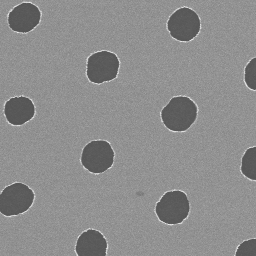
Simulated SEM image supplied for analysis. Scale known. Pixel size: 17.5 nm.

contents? holes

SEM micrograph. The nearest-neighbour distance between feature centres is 1.57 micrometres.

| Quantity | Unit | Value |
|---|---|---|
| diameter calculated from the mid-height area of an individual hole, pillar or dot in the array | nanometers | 573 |